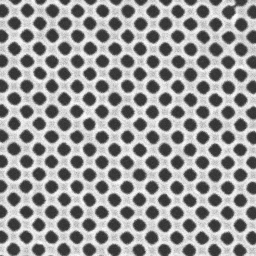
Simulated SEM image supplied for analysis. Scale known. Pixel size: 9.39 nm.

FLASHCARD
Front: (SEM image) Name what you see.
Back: a regular array of holes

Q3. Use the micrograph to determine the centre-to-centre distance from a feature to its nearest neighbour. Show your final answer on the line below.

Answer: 164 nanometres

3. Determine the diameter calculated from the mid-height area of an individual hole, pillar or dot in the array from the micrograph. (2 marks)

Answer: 130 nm